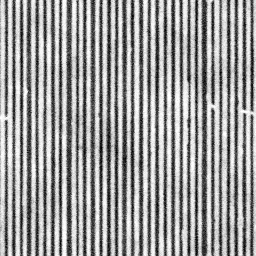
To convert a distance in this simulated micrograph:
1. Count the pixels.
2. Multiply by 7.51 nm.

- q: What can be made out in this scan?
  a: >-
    parallel lines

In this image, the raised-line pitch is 59.7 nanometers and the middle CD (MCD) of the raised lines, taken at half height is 28.2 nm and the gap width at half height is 28.2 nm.